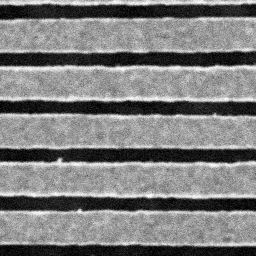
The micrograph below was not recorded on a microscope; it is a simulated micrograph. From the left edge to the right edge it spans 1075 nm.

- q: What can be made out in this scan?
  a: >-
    lines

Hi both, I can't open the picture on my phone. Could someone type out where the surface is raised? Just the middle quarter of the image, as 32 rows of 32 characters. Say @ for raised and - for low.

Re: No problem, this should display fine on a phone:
--------------------------------
@@@@@@@@@@@@@@@@@@@@@@@@@@@@@@@@
@@@@@@@@@@@@@@@@@@@@@@@@@@@@@@@@
@@@@@@@@@@@@@@@@@@@@@@@@@@@@@@@@
@@@@@@@@@@@@@@@@@@@@@@@@@@@@@@@@
@@@@@@@@@@@@@@@@@@@@@@@@@@@@@@@@
@@@@@@@@@@@@@@@@@@@@@@@@@@@@@@@@
@@@@@@@@@@@@@@@@@@@@@@@@@@@@@@@@
@@@@@@@@@@@@@@@@@@@@@@@@@@@@@@@@
--------------------------------
--------------------------------
--------------------------------
--------------------------------
@@@@@@@@@@@@@@@@@@@@@@@@@@@@@@@@
@@@@@@@@@@@@@@@@@@@@@@@@@@@@@@@@
@@@@@@@@@@@@@@@@@@@@@@@@@@@@@@@@
@@@@@@@@@@@@@@@@@@@@@@@@@@@@@@@@
@@@@@@@@@@@@@@@@@@@@@@@@@@@@@@@@
@@@@@@@@@@@@@@@@@@@@@@@@@@@@@@@@
@@@@@@@@@@@@@@@@@@@@@@@@@@@@@@@@
@@@@@@@@@@@@@@@@@@@@@@@@@@@@@@@@
--------------------------------
--------------------------------
--------------------------------
--------------------------------
@@@@@@@@@@@@@@@@@@@@@@@@@@@@@@@@
@@@@@@@@@@@@@@@@@@@@@@@@@@@@@@@@
@@@@@@@@@@@@@@@@@@@@@@@@@@@@@@@@
@@@@@@@@@@@@@@@@@@@@@@@@@@@@@@@@
@@@@@@@@@@@@@@@@@@@@@@@@@@@@@@@@
@@@@@@@@@@@@@@@@@@@@@@@@@@@@@@@@
@@@@@@@@@@@@@@@@@@@@@@@@@@@@@@@@